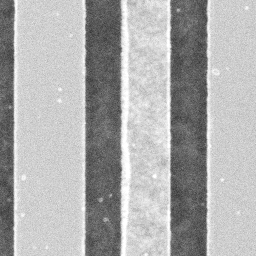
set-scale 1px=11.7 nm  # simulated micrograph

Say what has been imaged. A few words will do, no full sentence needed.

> lines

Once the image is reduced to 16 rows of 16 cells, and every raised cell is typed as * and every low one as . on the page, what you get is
.****...***..***
.****...***..***
.****...***..***
.****...***..***
.****...***..***
.****...***..***
.****...***..***
.****...***..***
.****...***..***
.****...***..***
.****...***..***
.****...***..***
.****...***..***
.****...***..***
.****...***..***
.****...***..***